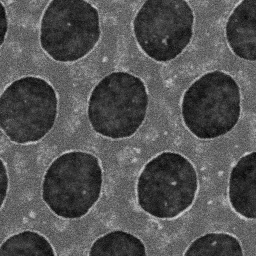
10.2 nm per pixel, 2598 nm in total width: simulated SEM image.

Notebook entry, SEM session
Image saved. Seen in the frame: holes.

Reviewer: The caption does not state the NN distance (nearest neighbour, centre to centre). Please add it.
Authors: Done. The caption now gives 0.931 microns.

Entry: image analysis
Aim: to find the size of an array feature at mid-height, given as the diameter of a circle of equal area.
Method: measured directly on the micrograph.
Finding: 648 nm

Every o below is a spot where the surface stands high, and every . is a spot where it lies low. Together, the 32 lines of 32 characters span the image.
oooooo.....ooooooo.....ooooooo..
.ooooo......ooooo.......ooooo...
.oooo.......ooooo.......oooo....
.oooo.......ooooo.......oooo....
.oooo.......ooooo.......oooo....
ooooo.......ooooo.......ooooo...
oooooo.....ooooooo.....oooooo...
ooooooo...ooooooooo..oooooooooo.
oooooooooooooooooooooooooooooooo
ooooooooooooo....oooooooo....ooo
o.....oooooo......oooooo......oo
.......oooo.......ooooo.......oo
.......oooo........oooo.......oo
.......oooo.......ooooo.......oo
.......oooo.......ooooo.......oo
.......oooo.......ooooo.......oo
......oooooo.....ooooooo....oooo
o....ooooooooooooooooooooooooooo
oooooooooooooooooooooooooooooooo
oooooooo....oooooooo...ooooooo..
.ooooo......oooooo......oooooo..
.ooooo.......ooooo......ooooo...
.oooo........oooo........oooo...
.oooo........oooo........oooo...
.oooo.......ooooo.......ooooo...
oooooo......ooooo.......ooooo...
ooooooo....ooooooo.....ooooooo..
oooooooooooooooooooooooooooooooo
oooooooooooooooooooooooooooooooo
o....oooooooo....oooooooo....ooo
......oooooo......oooooo......oo
.......oooo.......ooooo.......oo